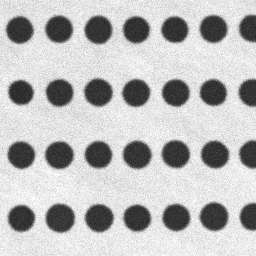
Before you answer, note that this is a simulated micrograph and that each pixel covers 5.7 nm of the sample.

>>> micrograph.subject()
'a regular array of holes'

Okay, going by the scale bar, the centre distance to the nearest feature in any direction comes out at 218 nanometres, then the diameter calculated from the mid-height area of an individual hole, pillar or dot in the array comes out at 155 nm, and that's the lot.